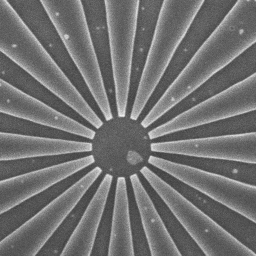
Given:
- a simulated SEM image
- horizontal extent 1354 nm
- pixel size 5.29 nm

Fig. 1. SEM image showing groups of lines, slits or small figures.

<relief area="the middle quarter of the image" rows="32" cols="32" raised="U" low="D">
DDDUUUUUUDDDUUUUUDDDUUUUUUDDDDDU
DDDDUUUUUDDDUUUUDDDDUUUUUDDDDDUU
DDDDUUUUUDDDUUUUDDDDUUUUUDDDDUUU
UDDDDUUUUDDDDUUUDDDUUUUUDDDDUUUU
UDDDDDUUUDDDDUUUDDDUUUUUDDDDUUUU
UUDDDDUUUUDDDUUUDDDUUUUDDDDUUUUU
UUUDDDDUUUDDDUUUDDUUUUDDDDUUUUUU
UUUUDDDUUUUDDUUUDDUUUUDDDUUUUUUD
UUUUUDDDUUUDDUUUDDUUUDDDUUUUUUDD
UUUUUDDDUUUDDUUUDDUUUDDDUUUUUDDD
DDUUUUDDDUUDDUUDDUUUDDDUUUUDDDDD
DDDUUUUDDUUDDDUDDUUDDDUUUUDDDDDU
DDDDUUUUDDUUDDUDDUUDDUUUUDDDDUUU
UDDDDUUUUDDDDDDDDUDDUUUDDDDDUUUU
UUUDDDUUUDDDDDDDDDDDUUDDDDUUUUUU
UUUUUDDDUDDDDDDDDDDDUDDDUUUUUUUU
UUUUUUUDDDDDDDDDDDDDDDUUUUUUDDDD
DDDUUUUUDDDDDDDDDDDDDUUUUDDDDDDD
DDDDDDDDDDDDDDDDDDDDDDDDDDDDDDDD
UUDDDDDDDDDDDDDDDDDDDDDDDDDDUUUU
UUUUUUUDDDDDDDDDDDDDDDUUUUUUUUUU
UUUUUUUDDDDDDDDDDDDDDDUUUUUUUUUU
DDDDDDDDDDDDDDDDDDDDDDDDDDDDDUUU
DDDDDUUDDDDDDDDDDUDDDUUUDDDDDDDD
DUUUUUUDDDDDDDDDDDDDDUUUUUUDDDDD
UUUUUUDDDDDDDDDDDDDDDDDUUUUUUUUD
UUUUDDDUUDDDDDDDDDDUUDDDDUUUUUUU
UUDDDDUUUDDDDDDDDDDDUUUDDDUUUUUU
DDDDDUUUDDUUDDUDDUDDDUUUDDDDUUUU
DDDUUUUDDDUUDUUDDUUDDUUUUDDDDDUU
DDUUUUDDDUUDDUUDDUUDDDUUUUDDDDDD
DUUUUUDDUUUDDUUUDDUUDDDUUUUUDDDD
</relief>